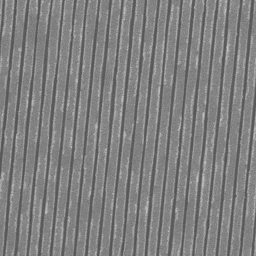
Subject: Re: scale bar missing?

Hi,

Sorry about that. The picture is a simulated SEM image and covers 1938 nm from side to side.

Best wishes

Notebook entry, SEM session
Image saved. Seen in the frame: parallel lines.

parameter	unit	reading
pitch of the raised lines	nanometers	89.2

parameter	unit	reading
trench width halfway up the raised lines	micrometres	0.0264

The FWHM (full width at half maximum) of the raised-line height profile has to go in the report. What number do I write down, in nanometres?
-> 66.9